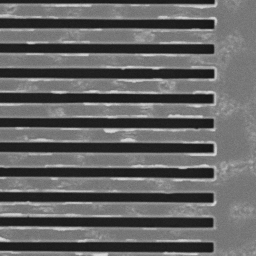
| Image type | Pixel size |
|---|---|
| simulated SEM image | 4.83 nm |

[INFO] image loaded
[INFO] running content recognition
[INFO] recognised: parallel lines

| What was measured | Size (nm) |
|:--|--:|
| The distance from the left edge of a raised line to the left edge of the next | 120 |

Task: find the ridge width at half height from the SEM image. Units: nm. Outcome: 76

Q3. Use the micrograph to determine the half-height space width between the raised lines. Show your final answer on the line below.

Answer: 0.0465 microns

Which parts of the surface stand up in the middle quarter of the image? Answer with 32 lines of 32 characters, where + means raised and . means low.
++++++++++++++++++++++++++++++++
................................
................................
................................
++++++++++++++++++++++++++++++++
++++++++++++++++++++++++++++++++
++++++++++++++++++++++++++++++++
................................
................................
................................
++++++++++++++++++++++++++++++++
++++++++++++++++++++++++++++++++
++++++++++++++++++++++++++++++++
.........+++++++++++++++++++++++
................................
................................
++++++++++++++++++++++++++++++++
++++++++++++++++++++++++++++++++
++++++++++++++++++++++++++++++++
++++++++++++++++++++++++++++++++
................................
................................
++++++++++++++++++++++++++++++++
++++++++++++++++++++++++++++++++
++++++++++++++++++++++++++++++++
++++++++++++++++++++++++++++++++
................................
................................
+++++++++++++++++++.............
++++++++++++++++++++++++++++++++
++++++++++++++++++++++++++++++++
++++++++++++++++++++++++++++++++